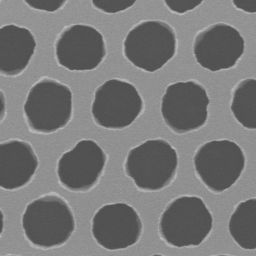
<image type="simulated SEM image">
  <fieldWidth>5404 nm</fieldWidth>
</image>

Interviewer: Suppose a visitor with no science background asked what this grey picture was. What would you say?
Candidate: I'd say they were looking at a regular array of holes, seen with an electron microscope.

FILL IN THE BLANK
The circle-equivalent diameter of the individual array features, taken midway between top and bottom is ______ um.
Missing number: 1.04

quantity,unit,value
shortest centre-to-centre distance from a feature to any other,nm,1400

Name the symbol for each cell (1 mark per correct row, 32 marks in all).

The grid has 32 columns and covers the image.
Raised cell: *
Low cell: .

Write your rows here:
****....****.....****....****...
*************..*******.********.
********************************
...******..******....*****...***
....****.....***......***.....**
....***......***......**......**
....***......***......**......**
....***......***.....****.....**
...*****....******..******..****
********************************
*****..******...******..******..
****.....***.....****.....***...
.**......***......**......***...
.**......***......**......***...
***......***.....***......***...
****....****....*****....*****..
**********************.*********
*******************.************
....*****....****.....***.....**
....****.....***......**......**
.....**......***......**......**
....***.....****......***.....**
...*****....*****....****....***
*********..*******..******..****
********************************
****....******..*****....*****..
***......***.....****.....***...
***......***.....***......***...
***......***......**......***...
***......***.....***......***...
*****...****.....*****...*****..
********************************